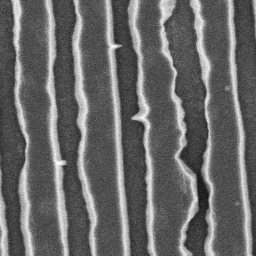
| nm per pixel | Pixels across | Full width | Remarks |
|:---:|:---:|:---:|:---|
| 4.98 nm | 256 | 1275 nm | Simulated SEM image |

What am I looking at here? one or a few lines or trenches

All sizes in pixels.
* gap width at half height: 24.8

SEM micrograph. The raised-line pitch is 304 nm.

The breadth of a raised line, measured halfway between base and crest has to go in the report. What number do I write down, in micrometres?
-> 0.181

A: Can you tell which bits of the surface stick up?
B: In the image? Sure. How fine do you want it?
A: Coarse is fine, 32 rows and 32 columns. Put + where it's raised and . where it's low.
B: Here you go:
..++++...+++++...++++...+++++...
..++++....++++...++++....++++...
..+++++...++++...+++.....++++...
..+++++...++++...+++.....++++...
..+++++...++++...+++.....++++...
..+++++..+++++...++++....++++...
..+++++..+++++...++++....++++...
..+++++...++++....+++....++++...
..++++....++++...+++++....+++...
..++++....++++...+++++....+++...
..++++....++++...+++++....+++...
..+++++...++++...+++++....++++..
..+++++...+++++...++++....++++..
..+++++...+++++...+++++...++++..
..+++++...+++++...+++++...++++..
...++++...+++++...+++++...++++..
...++++...+++++...+++++...++++..
...++++...+++++...+++++...++++..
...++++...+++++...+++++...++++..
...++++...+++++...++++....++++..
...+++++..+++++...+++++...++++..
...+++++..+++++....++++...++++..
...+++++..+++++...++++++..+++++.
...+++++...++++....++++++.+++++.
...+++++...++++....++++++.+++++.
...+++++...++++....++++++.+++++.
...+++++....++++...+++++..+++++.
...+++++....++++...+++++..+++++.
+..+++++...+++++...++++...+++++.
+..+++++...+++++...++++...+++++.
+..+++++...+++++...++++...+++++.
+...++++....++++...++++...+++++.